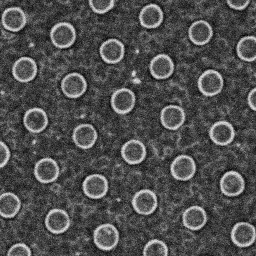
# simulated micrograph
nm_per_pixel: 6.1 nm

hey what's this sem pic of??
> a regular array of raised bodies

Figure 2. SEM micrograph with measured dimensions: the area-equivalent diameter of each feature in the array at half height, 139 nanometers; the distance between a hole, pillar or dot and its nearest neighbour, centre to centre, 313 nanometres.